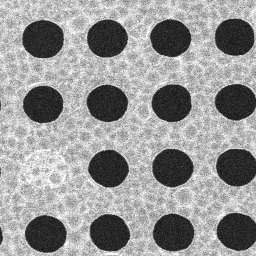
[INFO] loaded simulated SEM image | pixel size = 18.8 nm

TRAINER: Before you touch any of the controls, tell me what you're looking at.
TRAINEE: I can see a regular array of holes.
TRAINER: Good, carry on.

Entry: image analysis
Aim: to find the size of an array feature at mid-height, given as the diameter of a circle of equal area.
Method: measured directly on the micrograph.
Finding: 746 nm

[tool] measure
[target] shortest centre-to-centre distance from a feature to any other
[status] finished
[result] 1210 nm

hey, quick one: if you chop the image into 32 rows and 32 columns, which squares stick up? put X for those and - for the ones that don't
XXXXXXXXXXXXXXXXXXXXXXXXXXXXXXXX
XXXXXXXXXXXXXXXXXXXXXXXXXXXXXXXX
XXXXX-XXXXXXX-XXXXXXX-XXXXXX--XX
XXX-----XXX----XXXX----XXXX-----
XXX-----XXX-----XXX-----XXX-----
XXX-----XXX-----XXX-----XXX-----
XXX----XXXX----XXXXX---XXXXX---X
XXXXXXXXXXXXXXXXXXXXXXXXXXXXXXXX
XXXXXXXXXXXXXXXXXXXXXXXXXXXXXXXX
XXXXXXXXXXXXXXXXXXXXXXXXXXXXXXXX
XXXXXXXXXXXXXXXXXXXXXXXXXXXXX-XX
XXXX---XXXX----XXXX-----XXX-----
XXX-----XXX-----XXX-----XXX-----
XXX-----XXX-----XXX-----XXX-----
XXX----XXXXX---XXXXX---XXXXX---X
XXXXXXXXXXXXXXXXXXXXXXXXXXXXXXXX
XXXXXXXXXXXXXXXXXXXXXXXXXXXXXXXX
XXXXXXXXXXXXXXXXXXXXXXXXXXXXXXXX
XXXXXXXXXXXXXXXXXXXXXXXXXXXXXXXX
XXXXXXXXXXXX---XXXXX----XXX-----
XXXXXXXXXXX-----XXX-----XXX-----
XXXXXXXXXXX-----XXX-----XXX-----
XXXXXXXXXXXX----XXXX----XXXX----
XXXXXXXXXXXXXXXXXXXXXXXXXXXXXXXX
XXXXXXXXXXXXXXXXXXXXXXXXXXXXXXXX
XXXXXXXXXXXXXXXXXXXXXXXXXXXXXXXX
XXXXXXXXXXXXXXXXXXXXXXXXXXXXXXXX
XXXX---XXXXX---XXXXX----XXXX----
XXX-----XXX-----XXX-----XXX-----
XXX-----XXX-----XXX-----XXX-----
XXXX----XXXX----XXXX----XXXX----
XXXXX--XXXXXXXXXXXXXXXXXXXXXXXXX